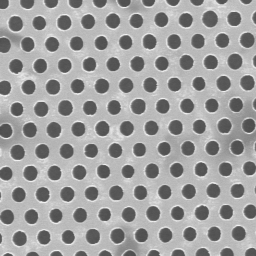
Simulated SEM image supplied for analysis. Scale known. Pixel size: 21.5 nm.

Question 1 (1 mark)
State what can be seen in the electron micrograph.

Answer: a regular array of holes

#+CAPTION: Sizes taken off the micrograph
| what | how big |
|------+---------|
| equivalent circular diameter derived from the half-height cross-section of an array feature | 0.311 um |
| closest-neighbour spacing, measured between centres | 0.519 micrometres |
